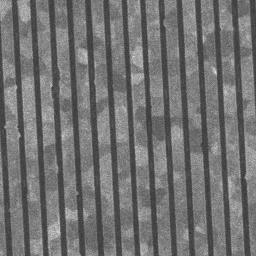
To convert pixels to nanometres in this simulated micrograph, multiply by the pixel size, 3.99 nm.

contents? parallel lines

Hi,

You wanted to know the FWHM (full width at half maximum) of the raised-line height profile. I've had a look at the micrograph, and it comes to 0.0498 µm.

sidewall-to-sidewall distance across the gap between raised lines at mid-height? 0.0229 microns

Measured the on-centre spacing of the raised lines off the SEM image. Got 72.9 nm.